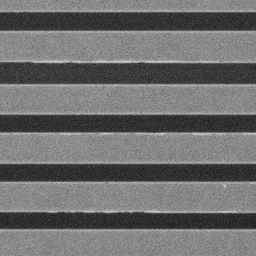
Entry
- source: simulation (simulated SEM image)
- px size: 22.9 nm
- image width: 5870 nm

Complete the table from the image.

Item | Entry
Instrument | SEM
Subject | lines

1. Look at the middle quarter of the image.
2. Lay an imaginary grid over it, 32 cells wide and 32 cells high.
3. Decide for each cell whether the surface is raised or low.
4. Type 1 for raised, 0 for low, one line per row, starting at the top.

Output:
00000000000000000000000000000000
00000000000000000000000000000000
00000000000000000000000000000000
00000000000000000000000000000000
00000000000000000000000000000000
11111111111111111111111111111111
11111111111111111111111111111111
11111111111111111111111111111111
11111111111111111111111111111111
11111111111111111111111111111111
11111111111111111111111111111111
11111111111111111111111111111111
00010000000000000000000000000000
00000000000000000000000000000000
00000000000000000000000000000000
00000000000000000000000000000000
00000000000000000000000000000000
11111111111111111111111111111111
11111111111111111111111111111111
11111111111111111111111111111111
11111111111111111111111111111111
11111111111111111111111111111111
11111111111111111111111111111111
11111111111111111111111111111111
11111111111111111111111111111111
00000000000000000000000000000000
00000000000000000000000000000000
00000000000000000000000000000000
00000000000000000000000000000000
00000000000000000000000000000000
11111111111111111111111111111111
11111111111111111111111111111111